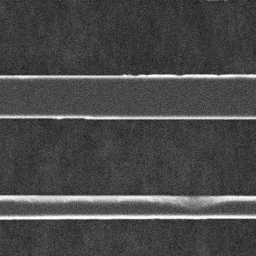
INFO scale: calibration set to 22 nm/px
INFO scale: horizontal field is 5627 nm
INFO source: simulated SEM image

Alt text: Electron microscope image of lines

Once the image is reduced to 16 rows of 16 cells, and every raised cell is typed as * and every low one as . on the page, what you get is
................
................
................
................
................
****************
****************
................
................
................
................
................
***********..***
****************
................
................